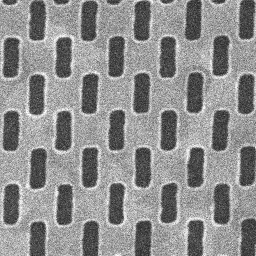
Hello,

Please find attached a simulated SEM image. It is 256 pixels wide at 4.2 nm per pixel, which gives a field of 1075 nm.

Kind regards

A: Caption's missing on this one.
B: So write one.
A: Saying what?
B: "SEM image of a regular array of holes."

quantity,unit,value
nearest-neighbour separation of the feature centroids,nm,187